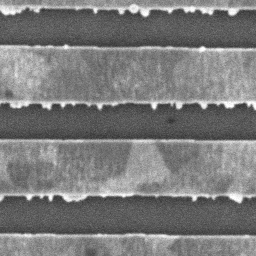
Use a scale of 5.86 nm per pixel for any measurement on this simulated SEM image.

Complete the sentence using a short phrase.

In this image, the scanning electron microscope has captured lines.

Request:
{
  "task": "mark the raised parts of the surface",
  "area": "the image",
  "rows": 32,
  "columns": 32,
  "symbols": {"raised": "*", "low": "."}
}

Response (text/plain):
********************************
.*................*.............
................................
................................
................................
................................
********************************
********************************
********************************
********************************
********************************
********************************
********************************
................................
................................
................................
................................
................................
********************************
********************************
********************************
********************************
********************************
********************************
......*.**..............*.*..**.
................................
................................
................................
................................
*********************.........*.
********************************
********************************